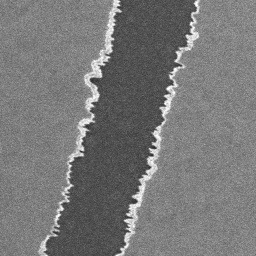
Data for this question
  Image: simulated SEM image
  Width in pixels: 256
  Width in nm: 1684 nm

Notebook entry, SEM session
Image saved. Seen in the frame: one or a few lines or trenches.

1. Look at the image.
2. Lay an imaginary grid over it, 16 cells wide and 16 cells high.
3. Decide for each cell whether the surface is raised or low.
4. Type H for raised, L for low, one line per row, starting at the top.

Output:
HHHHHHHLLLLLHHHH
HHHHHHHLLLLLHHHH
HHHHHHHLLLLLHHHH
HHHHHHHLLLLHHHHH
HHHHHHLLLLLHHHHH
HHHHHHLLLLLHHHHH
HHHHHHLLLLHHHHHH
HHHHHHLLLLHHHHHH
HHHHHLLLLLHHHHHH
HHHHHLLLLLHHHHHH
HHHHLLLLLHHHHHHH
HHHHLLLLLHHHHHHH
HHHHLLLLHHHHHHHH
HHHHLLLLHHHHHHHH
HHHLLLLLHHHHHHHH
HHHLLLLLHHHHHHHH